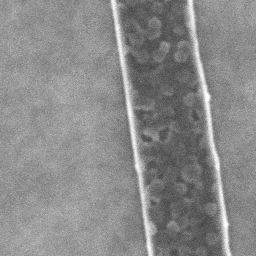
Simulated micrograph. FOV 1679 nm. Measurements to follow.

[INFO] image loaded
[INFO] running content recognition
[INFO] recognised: one or a few lines or trenches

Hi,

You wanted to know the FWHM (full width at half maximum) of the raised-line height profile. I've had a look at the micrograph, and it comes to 521 nm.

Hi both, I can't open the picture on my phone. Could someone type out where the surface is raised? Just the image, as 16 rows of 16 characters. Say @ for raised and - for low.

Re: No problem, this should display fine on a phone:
-------@@@@@----
-------@@@@@----
-------@@@@@----
--------@@@@----
--------@@@@@---
--------@@@@@---
--------@@@@@---
--------@@@@@---
--------@@@@@---
--------@@@@@---
---------@@@@@--
---------@@@@@--
---------@@@@@--
---------@@@@@--
---------@@@@@--
---------@@@@@--